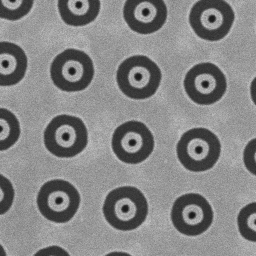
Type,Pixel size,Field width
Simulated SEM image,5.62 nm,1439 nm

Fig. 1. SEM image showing a regular array of ring-shaped grooves with a dot in the middle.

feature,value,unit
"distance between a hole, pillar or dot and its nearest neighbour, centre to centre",367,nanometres